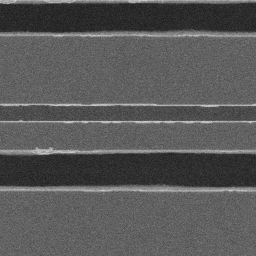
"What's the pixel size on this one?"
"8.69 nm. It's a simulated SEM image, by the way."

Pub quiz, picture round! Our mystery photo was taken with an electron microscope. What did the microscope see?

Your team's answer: lines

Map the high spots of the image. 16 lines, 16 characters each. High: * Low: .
................
................
****************
****************
****************
****************
****************
****************
****************
..***...........
................
................
****************
****************
****************
****************